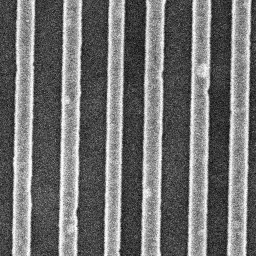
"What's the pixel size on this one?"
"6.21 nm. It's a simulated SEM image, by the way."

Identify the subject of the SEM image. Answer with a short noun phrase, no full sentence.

parallel lines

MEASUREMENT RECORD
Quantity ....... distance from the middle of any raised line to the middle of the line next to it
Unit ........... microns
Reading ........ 0.268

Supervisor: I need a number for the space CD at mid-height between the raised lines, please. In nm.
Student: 182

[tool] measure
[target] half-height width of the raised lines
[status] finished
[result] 99.3 nm